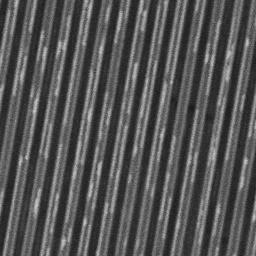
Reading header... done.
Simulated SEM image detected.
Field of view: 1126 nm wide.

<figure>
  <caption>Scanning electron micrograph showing parallel lines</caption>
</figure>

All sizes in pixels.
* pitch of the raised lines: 18.4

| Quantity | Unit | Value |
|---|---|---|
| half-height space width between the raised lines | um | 0.0428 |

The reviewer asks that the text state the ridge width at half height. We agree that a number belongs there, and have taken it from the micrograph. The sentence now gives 39.1 nanometres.